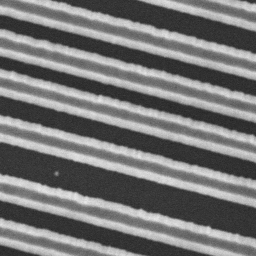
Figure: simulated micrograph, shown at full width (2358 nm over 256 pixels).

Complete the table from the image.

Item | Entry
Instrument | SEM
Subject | lines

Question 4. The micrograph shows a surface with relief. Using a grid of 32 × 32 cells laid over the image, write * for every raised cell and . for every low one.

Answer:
*******.............**********..
***********.............********
....**********..............****
........***********.............
**..........**********..........
******..........**********......
**********..........**********..
...**********..........*********
.......**********..........*****
**.........**********..........*
******.........**********.......
**********.........**********...
....**********.........*********
.......**********.........******
...........**********.........**
***............**********.......
*******............*********....
***********............*********
....**********............******
.........**********...........**
............**********..........
................**********......
**..................**********..
*****...................********
*********..................*****
...**********...................
.......**********...............
...........**********...........
***............**********.......
*******...........***********...
.**********...........**********
.....**********...........******